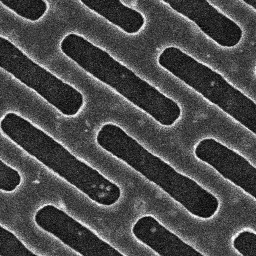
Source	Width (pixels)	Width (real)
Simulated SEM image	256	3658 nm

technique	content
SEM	holes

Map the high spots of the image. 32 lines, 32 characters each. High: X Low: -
------XXXXX----XXXXXX-----XXXXX-
XX----XXXXXX-----XXXXX------XXXX
XXXX-XXXXXXXX-----XXXXXX-----XXX
XXXXXXXXXXXXXXX---XXXXXXX-----XX
XXXXXXXX--XXXXXXXXXXXXXXXX----XX
--XXXXXX----XXXXXXXXXXXXXXX---XX
---XXXXX-----XXXXXXX---XXXXXXXXX
----XXXXX-----XXXXXX----XXXXXXXX
-----XXXXX------XXXXX-----XXXXXX
XX-----XXXXX-----XXXXX------XXXX
XXX-----XXXXX------XXXX------XXX
XXXXX-----XXXXX-----XXXXX-----XX
XXXXXX----XXXXXX------XXXX-----X
XXXXXXX---XXXXXXX-----XXXXXX----
X-XXXXXXXXXXXXXXXXX---XXXXXXX---
----XXXXXXXXX-XXXXXX-XXXXXXXXX--
------XXXXXX----XXXXXXXXXXXXXXXX
X------XXXXX-----XXXXXXXX--XXXXX
XXX-----XXXXX-----XXXXXXX----XXX
XXXX-----XXXXX-----XXXXXX-----XX
-XXXX------XXXXX-----XXXXX-----X
--XXXXX-----XXXXX-----XXXXX-----
---XXXXX------XXXXX-----XXXXX---
--XXXXXXXX-----XXXXX-----XXXXX--
XXXXXXXXXXX----XXXXXX------XXXXX
XXXXXXXXXXXXX-XXXXXXXXX----XXXXX
XXXXX---XXXXXXXXXXXXXXXX---XXXXX
XXXX-----XXXXXXXX--XXXXXXXXXXXXX
XXXXX------XXXXXX----XXXXXXXXXXX
--XXXXX-----XXXXX-----XXXXXXXX--
---XXXXX------XXXX-----XXXXXX---
----XXXXXX-----XXXXX-----XXXXX--